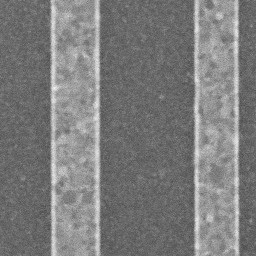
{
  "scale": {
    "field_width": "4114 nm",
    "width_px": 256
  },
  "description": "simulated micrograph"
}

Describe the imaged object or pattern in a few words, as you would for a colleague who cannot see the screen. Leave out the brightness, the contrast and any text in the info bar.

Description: one or a few lines or trenches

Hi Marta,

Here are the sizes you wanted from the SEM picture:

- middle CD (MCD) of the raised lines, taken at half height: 0.681 um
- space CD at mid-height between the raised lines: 1.59 µm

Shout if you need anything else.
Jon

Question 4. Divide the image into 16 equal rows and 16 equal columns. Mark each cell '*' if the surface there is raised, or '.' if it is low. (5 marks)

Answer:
...***......***.
...***......***.
...***......***.
...***......***.
...***......***.
...***......***.
...***......***.
...***......***.
...***......***.
...***......***.
...***......***.
...***......***.
...***......***.
...***......***.
...***......***.
...***......***.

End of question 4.